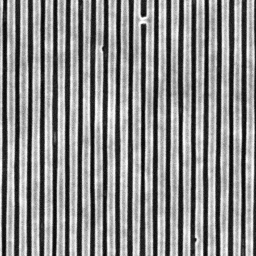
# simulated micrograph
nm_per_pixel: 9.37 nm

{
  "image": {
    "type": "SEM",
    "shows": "parallel lines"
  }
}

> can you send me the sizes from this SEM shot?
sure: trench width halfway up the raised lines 51.5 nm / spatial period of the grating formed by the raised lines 12.6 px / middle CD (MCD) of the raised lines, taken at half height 69.1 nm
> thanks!